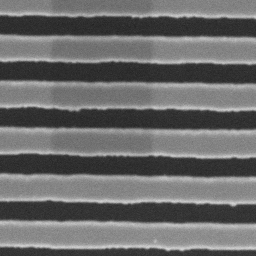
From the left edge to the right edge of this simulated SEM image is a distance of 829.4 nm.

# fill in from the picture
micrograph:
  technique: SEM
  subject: lines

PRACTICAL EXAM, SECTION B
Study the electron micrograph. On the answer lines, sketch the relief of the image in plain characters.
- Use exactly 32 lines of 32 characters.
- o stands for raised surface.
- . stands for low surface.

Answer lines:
oooooooooooooooooooooooooooooooo
oooooooooooooooooooooooooooooooo
................................
................................
................................
oooooooooooooooooooooooooooooooo
oooooooooooooooooooooooooooooooo
oooooooooooooooooooooooooooooooo
................................
................................
oooooooooooooooooooooooooo......
oooooooooooooooooooooooooooooooo
oooooooooooooooooooooooooooooooo
.....ooooooooooooooooooooooooooo
................................
................................
oooooooooooooooooooooooooooooooo
oooooooooooooooooooooooooooooooo
oooooooooooooooooooooooooooooooo
.....................ooooooooooo
................................
................................
oooooooooooooooooooooooooooooooo
oooooooooooooooooooooooooooooooo
oooooooooooooooooooooooooooooooo
.............................o..
................................
................................
oooooooooooooooooooooooooooooooo
oooooooooooooooooooooooooooooooo
oooooooooooooooooooooooooooooooo
................................